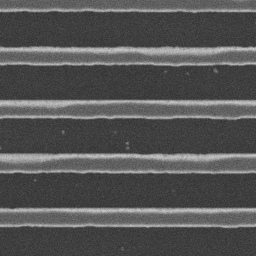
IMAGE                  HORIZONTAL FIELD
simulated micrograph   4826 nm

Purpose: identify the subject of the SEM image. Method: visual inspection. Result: lines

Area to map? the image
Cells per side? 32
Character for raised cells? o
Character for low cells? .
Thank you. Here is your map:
oooooooooooooooooooooooooooooooo
................................
................................
................................
................................
................................
oooooooooooooooooooooooooooooooo
oooooooooooooooooooooooooooooooo
................................
................................
................................
................................
................................
oooooooooooooooooooooooooooooooo
oooooooooooooooooooooooooooooooo
................................
................................
................................
................................
oooooooooooooooooooooooooooooooo
oooooooooooooooooooooooooooooooo
ooooo.....o.oooooooooooooooooooo
................................
................................
................................
................................
oooooooooooooooooooooooooooooooo
oooooooooooooooooooooooooooooooo
................................
................................
................................
................................